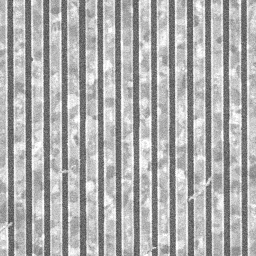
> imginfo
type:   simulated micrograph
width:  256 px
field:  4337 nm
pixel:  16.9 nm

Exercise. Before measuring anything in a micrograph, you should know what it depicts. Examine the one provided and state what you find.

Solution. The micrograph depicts parallel lines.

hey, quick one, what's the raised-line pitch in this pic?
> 304 nm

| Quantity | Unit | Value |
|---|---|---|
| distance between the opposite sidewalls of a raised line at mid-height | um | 0.182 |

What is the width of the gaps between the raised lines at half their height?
131 nanometers